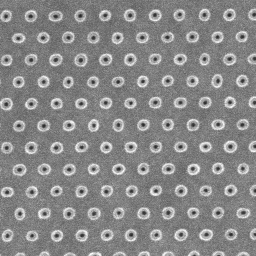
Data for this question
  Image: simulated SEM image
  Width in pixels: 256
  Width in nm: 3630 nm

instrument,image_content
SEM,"a regular array of ring-shaped raised bodies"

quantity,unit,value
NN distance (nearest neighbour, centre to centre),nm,348